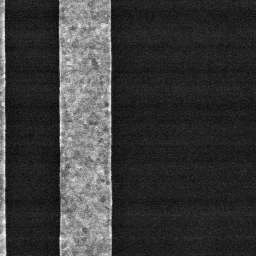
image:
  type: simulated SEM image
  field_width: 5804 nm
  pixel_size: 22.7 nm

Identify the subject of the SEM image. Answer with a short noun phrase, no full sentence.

wiring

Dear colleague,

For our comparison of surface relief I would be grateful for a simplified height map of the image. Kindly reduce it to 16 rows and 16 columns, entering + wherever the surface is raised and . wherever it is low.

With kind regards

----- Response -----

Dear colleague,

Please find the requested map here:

....+++.........
....+++.........
....+++.........
....+++.........
....+++.........
....+++.........
....+++.........
....+++.........
....+++.........
....+++.........
....+++.........
....+++.........
....+++.........
....+++.........
....+++.........
....+++.........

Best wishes